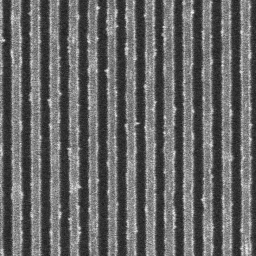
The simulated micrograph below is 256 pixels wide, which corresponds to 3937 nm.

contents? parallel lines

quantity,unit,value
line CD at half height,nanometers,190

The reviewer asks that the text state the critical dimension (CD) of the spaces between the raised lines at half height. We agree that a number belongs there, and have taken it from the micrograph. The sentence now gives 96.1 nanometres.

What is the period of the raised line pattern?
294 nm